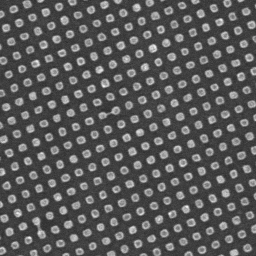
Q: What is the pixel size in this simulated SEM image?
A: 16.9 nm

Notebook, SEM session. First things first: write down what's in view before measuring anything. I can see a regular array of raised bodies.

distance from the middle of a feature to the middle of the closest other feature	240	nm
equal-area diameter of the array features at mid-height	122	nm